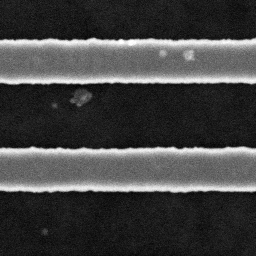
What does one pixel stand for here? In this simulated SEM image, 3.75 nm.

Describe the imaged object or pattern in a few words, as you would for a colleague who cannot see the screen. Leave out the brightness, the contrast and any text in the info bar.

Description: lines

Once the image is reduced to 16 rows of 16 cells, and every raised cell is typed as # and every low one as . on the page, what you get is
................
................
#######.########
################
################
................
................
................
................
################
################
################
................
................
................
................